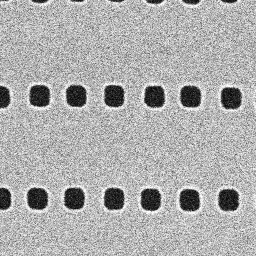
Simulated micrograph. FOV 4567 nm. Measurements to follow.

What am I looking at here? a regular array of holes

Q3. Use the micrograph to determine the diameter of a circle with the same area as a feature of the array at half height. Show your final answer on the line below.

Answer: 0.419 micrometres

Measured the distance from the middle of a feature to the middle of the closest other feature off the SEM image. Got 660 nanometers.